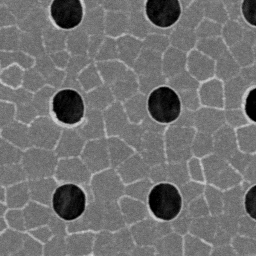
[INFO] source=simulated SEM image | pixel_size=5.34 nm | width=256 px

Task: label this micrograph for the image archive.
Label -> holes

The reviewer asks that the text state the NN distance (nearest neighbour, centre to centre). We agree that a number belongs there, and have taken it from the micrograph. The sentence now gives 510 nanometers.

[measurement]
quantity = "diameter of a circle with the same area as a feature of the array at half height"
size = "191 nm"